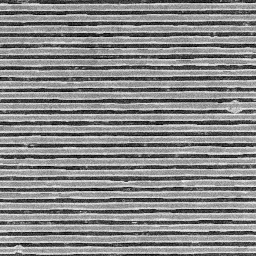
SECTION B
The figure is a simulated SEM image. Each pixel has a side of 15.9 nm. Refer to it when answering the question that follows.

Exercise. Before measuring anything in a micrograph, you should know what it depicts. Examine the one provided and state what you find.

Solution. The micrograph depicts parallel lines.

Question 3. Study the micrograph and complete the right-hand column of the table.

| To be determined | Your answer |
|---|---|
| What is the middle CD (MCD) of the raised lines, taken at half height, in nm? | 89.7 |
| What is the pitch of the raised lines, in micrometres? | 0.176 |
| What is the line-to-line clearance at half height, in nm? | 87.7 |